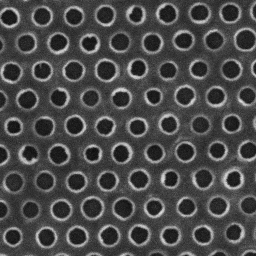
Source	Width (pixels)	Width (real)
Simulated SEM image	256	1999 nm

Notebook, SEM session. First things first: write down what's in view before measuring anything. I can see a regular array of holes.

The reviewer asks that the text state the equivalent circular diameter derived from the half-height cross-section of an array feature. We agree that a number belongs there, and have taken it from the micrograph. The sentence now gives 129 nanometres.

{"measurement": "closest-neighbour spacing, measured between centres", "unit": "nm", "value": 238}